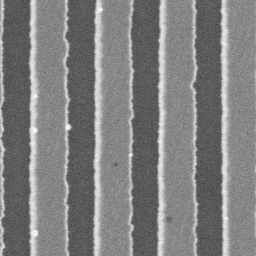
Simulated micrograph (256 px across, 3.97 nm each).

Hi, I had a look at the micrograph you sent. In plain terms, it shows lines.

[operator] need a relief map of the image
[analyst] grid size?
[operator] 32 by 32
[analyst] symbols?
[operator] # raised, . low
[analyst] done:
....####....#####...####....####
....####....####....####....####
....####....####....####....####
....####....####....####....####
....####....####....####....####
....####....####....####....####
....####....####....####....####
....####....####....####....####
....####....####....#####...####
....####....#####...####....####
....####....####....####....####
....####....####....####....####
....#####...####....####....####
....####....#####...####....####
....####....#####...####....####
....#####...####....####....####
....####....####....####....####
....####....####....####....####
....####....####....####....####
....####....####....####....####
....####....####....####....####
....####....####....####....####
....####....####....####....####
....####....####....####....####
....####....####....####....####
....####....####....#####...####
....####....####....#####...####
....####....####....#####...####
....####....#####...####....####
....####....####....####....####
....####....####....####....####
....####....####....####....####